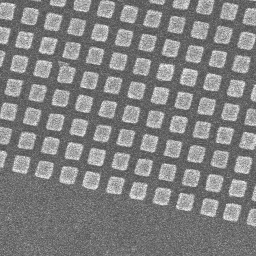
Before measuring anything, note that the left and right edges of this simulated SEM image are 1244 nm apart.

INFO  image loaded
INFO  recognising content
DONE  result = a regular array of raised bodies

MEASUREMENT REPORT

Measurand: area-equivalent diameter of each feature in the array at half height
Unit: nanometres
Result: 85.7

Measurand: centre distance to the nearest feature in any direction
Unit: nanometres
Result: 116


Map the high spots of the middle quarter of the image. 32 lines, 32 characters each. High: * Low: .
...........****...***...***.....
***..............****...***...**
***..***..........***..****...**
**...***...***.........****..***
**..****...***...............***
....****..****...***............
..........****..****...***......
*...............****..****..****
*...***..........***..****..****
*..****...**..........****..****
*..****..****...*...........****
...****..****..****.............
.........****..****..****.......
...............***...****..***..
..****..........**...***...****.
..****..***..........***...***..
..***...****..**...........***..
..***...***...****..............
........***...***...***.........
.............****...***...***...
.****..........**..****...***...
.****..***..........***..****...
****..****...**..........****..*
.***..****...***...............*
......****..****..****..........
............****..****..****....
***...............****..****...*
***..****.........***...****..**
***..****..***..........***...**
**...****..****...............**
.....***...****..****...........
...........***...****..***......